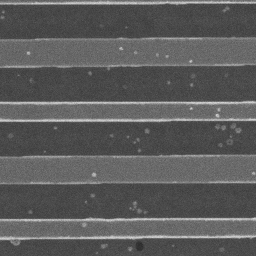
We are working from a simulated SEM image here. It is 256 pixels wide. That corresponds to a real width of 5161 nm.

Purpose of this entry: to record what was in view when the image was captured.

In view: lines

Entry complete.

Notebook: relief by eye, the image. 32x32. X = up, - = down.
--------------------------------
--------------------------------
--------------------------------
--------------------------------
--------------------------------
XXXXXXXXXXXXXXXXXXXXXXXXXXXXXXXX
XXXXXXXXXXXXXXXXXXXXXXXXXXXXXXXX
XXXXXXXXXXXXXXXXXXXXXXXXXXXXXXXX
--------------------------------
--------------------------------
--------------------------------
--------------------------------
--------------------------------
XXXXXXXXXXXXXXXXXXXXXXXXXXXXXXXX
XXXXXXXXXXXXXXXXXXXXXXXXXXXXXXXX
--------------------------------
--------------------------------
--------------------------------
--------------------------------
--------------------XXXXXXXXXXXX
XXXXXXXXXXXXXXXXXXXXXXXXXXXXXXXX
XXXXXXXXXXXXXXXXXXXXXXXXXXXXXXXX
XXXXXXXXXXXXXXXXXXXXXXXXXXXXXXXX
--------------------------------
--------------------------------
--------------------------------
--------------------------------
XXXXXXXXXXXXXXXXXXXXXXXXXXXXXXXX
XXXXXXXXXXXXXXXXXXXXXXXXXXXXXXXX
XXXXXXXXXXXXXXXXXXXXXXXXXXXXXXXX
--------------------------------
--------------------------------